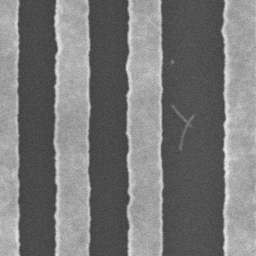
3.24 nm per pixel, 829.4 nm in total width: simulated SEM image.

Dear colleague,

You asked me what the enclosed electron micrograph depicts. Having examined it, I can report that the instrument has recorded lines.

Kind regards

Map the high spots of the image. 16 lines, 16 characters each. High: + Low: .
+..+++..++....++
+..+++..++....++
+...++..++....++
+...++..++....++
+..+++..++....++
+..+++..++....++
+..+++..++....++
+..+++..++....++
+..+++..++....++
+..+++..++....++
+..+++..++....++
+...++..++....++
+...++..++....++
+..+++..++....++
+..+++..++....++
+..+++..++....++